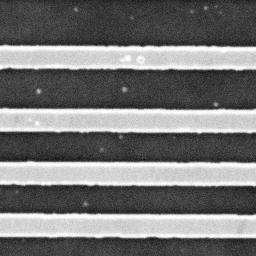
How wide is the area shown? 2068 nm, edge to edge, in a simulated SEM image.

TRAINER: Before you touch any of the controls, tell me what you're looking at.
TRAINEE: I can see lines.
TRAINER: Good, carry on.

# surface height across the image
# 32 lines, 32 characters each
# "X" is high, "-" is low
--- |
--------------------------------
--------------------------------
--------------------------------
--------------------------------
--------------------------------
--------------------------------
XXXXXXXXXXXXXXXXXXXXXXXXXXXXXXXX
XXXXXXXXXXXXXXXXXXXXXXXXXXXXXXXX
X---X---XXXXXXX-XXXXXXXXXXXXXXXX
--------------------------------
--------------------------------
--------------------------------
--------------------------------
--------------------------------
XXXXXXXXXXXXXXXXXXXXXXXXXXXXXXXX
XXXXXXXXXXXXXXXXXXXXXXXXXXXXXXXX
-------------------------XX-----
--------------------------------
--------------------------------
--------------------------------
XXXXXXXXXXXXXXXXXXXXX---XX-XXX--
XXXXXXXXXXXXXXXXXXXXXXXXXXXXXXXX
XXXXXXXXXXXXXXXXXXXXXXXXXXXXXXXX
--------------------------------
--------------------------------
--------------------------------
--------------------------------
XXXXXXXXXXXXXXXXXXXXXXXXXXXXXXXX
XXXXXXXXXXXXXXXXXXXXXXXXXXXXXXXX
------X----XX--XXXXXXXXXXXXXXXXX
--------------------------------
--------------------------------